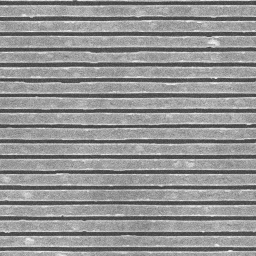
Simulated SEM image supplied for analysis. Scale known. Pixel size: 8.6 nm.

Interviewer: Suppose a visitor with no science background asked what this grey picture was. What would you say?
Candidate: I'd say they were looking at parallel lines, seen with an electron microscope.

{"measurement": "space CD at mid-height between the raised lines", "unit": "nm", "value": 37.6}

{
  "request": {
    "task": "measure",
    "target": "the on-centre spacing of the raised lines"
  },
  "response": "15.3 px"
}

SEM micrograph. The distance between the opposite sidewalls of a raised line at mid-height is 0.0978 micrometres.